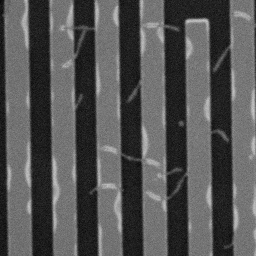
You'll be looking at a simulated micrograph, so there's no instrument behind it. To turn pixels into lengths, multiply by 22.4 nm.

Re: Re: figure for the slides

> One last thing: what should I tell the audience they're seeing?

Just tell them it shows groups of lines, slits or small figures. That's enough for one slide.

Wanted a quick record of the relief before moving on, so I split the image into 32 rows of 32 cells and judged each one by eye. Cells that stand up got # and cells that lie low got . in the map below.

.##...###...###...##.........###
.##...###...###...##.........###
.##...###...###...##.........###
.##...###...###...##...###...###
.##...###...###...##...###...###
.##...###...###...##....##...###
.###..###...###...##....##...###
.###..###...###...##...###...###
.###..###...###...##...###...###
.###..###...###...##...###...###
.###..###...###...###..###...###
.###..###...###...###..###...###
.###..###...###...###..###...###
.###..###...###...###..###...###
.###..###...###...##...###...###
.###...##...###...###..###...###
.###...##...###...###..###...###
.###...##...###...###...##...###
.###...##...###...###...##...###
.###...##...###...###...##...###
.###...##...###...###...##...###
.##....##...###...###..###...###
.###...##...###...###...##...###
.###...##...###...###...##...###
.###...##...###...###...##...###
.###...##...###...###...##...###
.###...###..###...###...##...###
.###...###..###...###...##....##
.###...###..###...###...##...###
.###...###..###...###...##...###
.###...###..###...###...##...###
.###...###..###...###...##...###